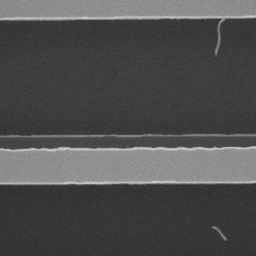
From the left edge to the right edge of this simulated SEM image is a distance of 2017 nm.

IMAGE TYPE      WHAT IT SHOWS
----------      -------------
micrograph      lines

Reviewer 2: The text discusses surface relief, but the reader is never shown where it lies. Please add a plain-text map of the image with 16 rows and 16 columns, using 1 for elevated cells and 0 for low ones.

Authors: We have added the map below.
1111111111111111
0000000000000000
0000000000000000
0000000000000000
0000000000000000
0000000000000000
0000000000000000
0000000000000000
0000000000000000
1111111111111111
1111111111111111
0000000000000000
0000000000000000
0000000000000000
0000000000000000
0000000000000000